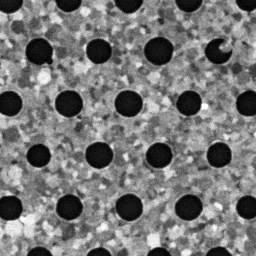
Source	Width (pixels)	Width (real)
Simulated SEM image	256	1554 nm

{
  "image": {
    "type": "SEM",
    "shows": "a regular array of holes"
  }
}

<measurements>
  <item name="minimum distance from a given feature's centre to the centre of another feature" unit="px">59.5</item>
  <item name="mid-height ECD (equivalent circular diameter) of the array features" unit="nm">171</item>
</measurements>